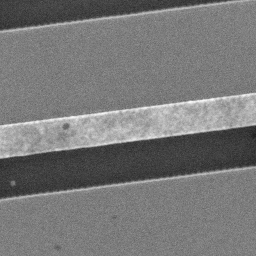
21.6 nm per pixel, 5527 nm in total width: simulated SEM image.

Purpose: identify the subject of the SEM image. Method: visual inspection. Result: lines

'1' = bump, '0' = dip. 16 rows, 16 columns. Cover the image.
0000000000001111
0000111111111111
1111111111111111
1111111111111111
1111111111111111
1111111111111111
1111111111111111
1111111111111111
1111111111100000
1110000000000000
0000000000000000
0000000011111111
1111111111111111
1111111111111111
1111111111111111
1111111111111111